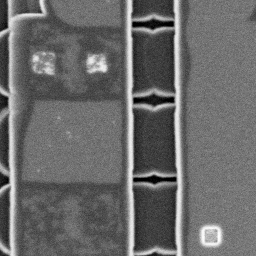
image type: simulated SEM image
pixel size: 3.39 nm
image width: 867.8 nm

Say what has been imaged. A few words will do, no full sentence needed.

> wiring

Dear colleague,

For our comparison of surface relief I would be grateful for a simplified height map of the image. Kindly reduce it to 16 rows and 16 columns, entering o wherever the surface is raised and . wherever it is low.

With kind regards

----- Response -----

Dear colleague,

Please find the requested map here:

..oooooo...ooooo
.ooooooo...ooooo
.ooooooo...ooooo
.ooooooo...ooooo
.ooooooo...ooooo
.ooooooo...ooooo
.ooooooo...ooooo
.ooooooo...ooooo
.ooooooo...ooooo
.ooooooo...ooooo
.ooooooo...ooooo
.ooooooo...ooooo
.ooooooo...ooooo
.ooooooo...ooooo
.ooooooo...ooooo
.ooooooo...ooooo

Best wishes